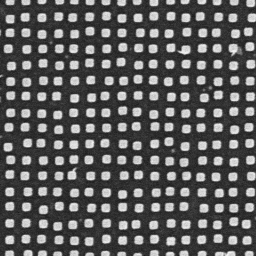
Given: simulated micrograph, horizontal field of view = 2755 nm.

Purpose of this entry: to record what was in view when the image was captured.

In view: a regular array of raised bodies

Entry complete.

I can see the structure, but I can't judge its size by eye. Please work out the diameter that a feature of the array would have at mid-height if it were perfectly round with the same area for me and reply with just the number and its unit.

0.0948 microns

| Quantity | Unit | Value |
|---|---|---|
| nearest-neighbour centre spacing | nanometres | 156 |